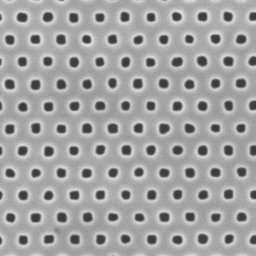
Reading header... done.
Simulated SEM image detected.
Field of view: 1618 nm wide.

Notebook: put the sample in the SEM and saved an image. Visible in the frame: a regular array of holes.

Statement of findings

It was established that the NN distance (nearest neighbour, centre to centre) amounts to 0.159 µm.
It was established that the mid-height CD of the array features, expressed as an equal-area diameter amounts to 59.2 nm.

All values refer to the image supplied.